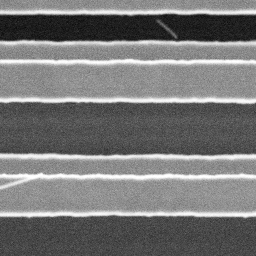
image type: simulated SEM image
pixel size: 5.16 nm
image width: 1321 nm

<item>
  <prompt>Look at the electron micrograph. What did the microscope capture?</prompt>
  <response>lines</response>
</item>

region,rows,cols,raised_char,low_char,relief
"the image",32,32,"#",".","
################################
################################
................................
................................
................................
################################
################################
################################
################################
################################
################################
################################
################################
................................
................................
................................
................................
................................
................................
................................
################################
################################
################################
################################
################################
################################
################################
................................
................................
................................
................................
................................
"